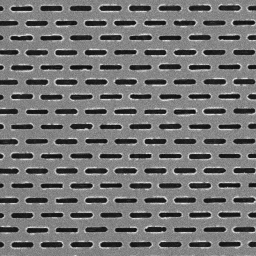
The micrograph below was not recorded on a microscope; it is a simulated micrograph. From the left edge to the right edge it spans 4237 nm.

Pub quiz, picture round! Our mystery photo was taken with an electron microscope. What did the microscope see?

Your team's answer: a regular array of holes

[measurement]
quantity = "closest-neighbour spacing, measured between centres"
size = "340 nanometers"